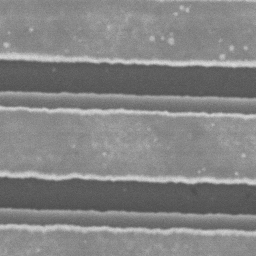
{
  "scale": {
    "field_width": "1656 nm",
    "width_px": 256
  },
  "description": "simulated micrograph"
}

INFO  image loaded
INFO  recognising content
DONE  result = lines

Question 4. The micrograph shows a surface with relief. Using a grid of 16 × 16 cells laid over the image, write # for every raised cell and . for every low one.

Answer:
################
################
################
################
................
................
................
################
################
################
################
................
................
................
################
################